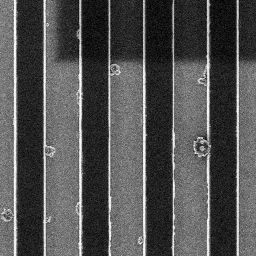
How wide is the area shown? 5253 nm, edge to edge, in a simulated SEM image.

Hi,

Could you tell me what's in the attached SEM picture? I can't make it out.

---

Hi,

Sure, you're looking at lines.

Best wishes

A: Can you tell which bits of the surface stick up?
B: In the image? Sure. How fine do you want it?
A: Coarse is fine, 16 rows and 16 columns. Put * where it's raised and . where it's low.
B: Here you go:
.**..**..**..**.
.**..**..**..**.
.**..**..**..**.
.**..**..**..**.
.**..**..**..**.
.**..**..**..**.
.**..**..**..**.
.**..**..**..**.
.**..**..**..**.
.**..**..**.***.
.**..**..**..**.
.**..**..**..**.
.**..**..**..**.
.**..**..**..**.
.**..**..**..**.
.**..**..**..**.